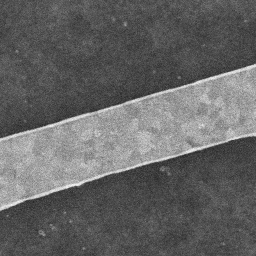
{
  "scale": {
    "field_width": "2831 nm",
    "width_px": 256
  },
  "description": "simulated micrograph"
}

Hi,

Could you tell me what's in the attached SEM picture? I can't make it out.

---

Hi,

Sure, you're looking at one or a few lines or trenches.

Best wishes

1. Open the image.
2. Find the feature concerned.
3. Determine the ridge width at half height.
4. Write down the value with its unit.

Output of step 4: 64.2 px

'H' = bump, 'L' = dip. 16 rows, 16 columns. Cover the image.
LLLLLLLLLLLLLLLL
LLLLLLLLLLLLLLLL
LLLLLLLLLLLLLLLL
LLLLLLLLLLLLLLLL
LLLLLLLLLLLLLLLH
LLLLLLLLLLLHHHHH
LLLLLLLLHHHHHHHH
LLLLHHHHHHHHHHHH
LHHHHHHHHHHHHHHL
HHHHHHHHHHHHLLLL
HHHHHHHHLLLLLLLL
HHHHHLLLLLLLLLLL
HHLLLLLLLLLLLLLL
LLLLLLLLLLLLLLLL
LLLLLLLLLLLLLLLL
LLLLLLLLLLLLLLLL